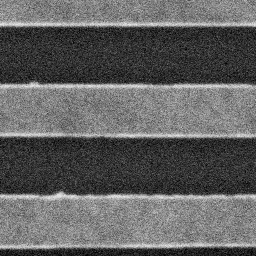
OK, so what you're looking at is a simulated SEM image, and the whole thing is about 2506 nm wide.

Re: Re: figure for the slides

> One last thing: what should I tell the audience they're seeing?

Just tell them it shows lines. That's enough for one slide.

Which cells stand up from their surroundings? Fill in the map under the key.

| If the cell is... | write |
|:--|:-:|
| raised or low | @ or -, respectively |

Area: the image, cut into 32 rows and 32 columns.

@@@@@@@@@@@@@@@@@@@@@@@@@@@@@@@@
@@@@@@@@@@@@@@@@@@@@@@@@@@@@@@@@
@@@@@@@@@@@@@@@@@@@@@@@@@@@@@@@@
--------------------------------
--------------------------------
--------------------------------
--------------------------------
--------------------------------
--------------------------------
--------------------------------
--------------------------------
@@@@@@@@@@@@@@@@@@@@@@@@@@@@@@@@
@@@@@@@@@@@@@@@@@@@@@@@@@@@@@@@@
@@@@@@@@@@@@@@@@@@@@@@@@@@@@@@@@
@@@@@@@@@@@@@@@@@@@@@@@@@@@@@@@@
@@@@@@@@@@@@@@@@@@@@@@@@@@@@@@@@
@@@@@@@@@@@@@@@@@@@@@@@@@@@@@@@@
--------------------------------
--------------------------------
--------------------------------
--------------------------------
--------------------------------
--------------------------------
--------------------------------
@@@@@-@@@@-@-@@@@@@@@-@---@@@@@@
@@@@@@@@@@@@@@@@@@@@@@@@@@@@@@@@
@@@@@@@@@@@@@@@@@@@@@@@@@@@@@@@@
@@@@@@@@@@@@@@@@@@@@@@@@@@@@@@@@
@@@@@@@@@@@@@@@@@@@@@@@@@@@@@@@@
@@@@@@@@@@@@@@@@@@@@@@@@@@@@@@@@
@@@@@@@@@@@@@@@@@@@@@@@@@@@@@@@@
--------------------------------